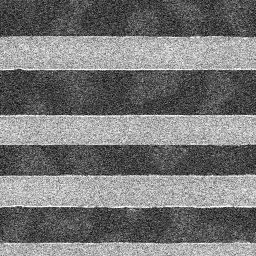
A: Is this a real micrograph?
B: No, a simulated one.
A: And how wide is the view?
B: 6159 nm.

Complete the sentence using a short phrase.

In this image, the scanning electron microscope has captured one or a few lines or trenches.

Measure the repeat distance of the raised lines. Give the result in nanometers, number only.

1670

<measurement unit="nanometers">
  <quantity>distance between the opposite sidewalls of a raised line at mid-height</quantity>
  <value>749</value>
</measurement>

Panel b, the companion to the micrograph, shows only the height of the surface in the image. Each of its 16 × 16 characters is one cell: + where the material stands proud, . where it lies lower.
................
................
++++++++++++++++
++++++++++++++++
................
................
................
++++++++++++++++
++++++++++++++++
................
................
++++++++++++++++
++++++++++++++++
................
................
++++++++++++++++